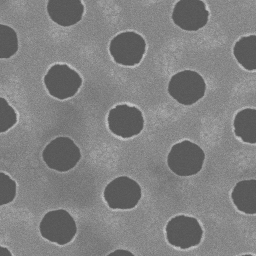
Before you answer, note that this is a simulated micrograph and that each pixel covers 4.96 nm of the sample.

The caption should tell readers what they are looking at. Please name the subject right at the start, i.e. a regular array of holes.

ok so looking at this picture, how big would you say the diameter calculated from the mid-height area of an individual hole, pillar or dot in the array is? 0.172 µm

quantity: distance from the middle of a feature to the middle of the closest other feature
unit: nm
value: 357